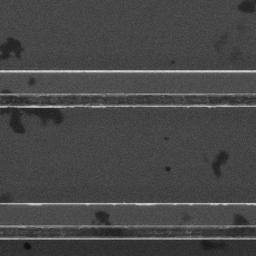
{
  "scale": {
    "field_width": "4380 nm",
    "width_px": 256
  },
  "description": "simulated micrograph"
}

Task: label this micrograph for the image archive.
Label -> lines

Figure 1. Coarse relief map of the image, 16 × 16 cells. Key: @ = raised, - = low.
----------------
----------------
----------------
----------------
@@@@@@@@@@@@@@@@
@@@@@@@@@@@@@@@@
@@@@@@@@@@@@@@@@
----------------
----------------
----------------
----------------
----------------
----------------
@@@@@@@@@@@@@@@@
@@@@@@@@@@@@@@@@
----------------